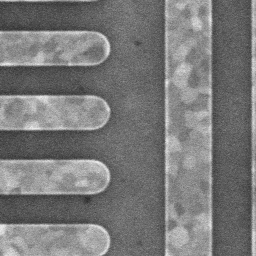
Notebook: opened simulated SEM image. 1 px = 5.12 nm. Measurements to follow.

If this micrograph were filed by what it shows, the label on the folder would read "groups of lines, slits or small figures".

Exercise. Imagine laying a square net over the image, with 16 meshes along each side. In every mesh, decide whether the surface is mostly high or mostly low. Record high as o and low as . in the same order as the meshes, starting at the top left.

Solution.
..........ooo...
..........ooo...
ooooooo...ooo...
ooooooo...ooo...
..........ooo...
..........ooo...
ooooooo...ooo...
ooooooo...ooo...
..........ooo...
..........ooo...
ooooooo...ooo...
ooooooo...ooo...
..........ooo...
..........ooo...
ooooooo...ooo...
ooooooo...ooo...